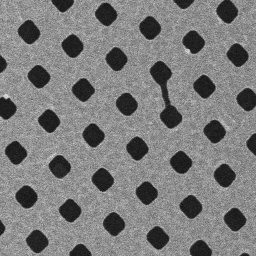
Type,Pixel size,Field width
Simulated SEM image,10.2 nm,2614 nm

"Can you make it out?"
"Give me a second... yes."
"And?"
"a regular array of holes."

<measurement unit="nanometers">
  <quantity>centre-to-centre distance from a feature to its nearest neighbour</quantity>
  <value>463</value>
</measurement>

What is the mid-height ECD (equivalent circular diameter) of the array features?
221 nm